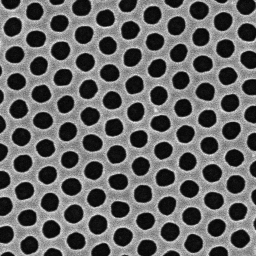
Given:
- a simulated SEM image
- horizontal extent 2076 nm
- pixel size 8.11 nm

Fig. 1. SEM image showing a regular array of holes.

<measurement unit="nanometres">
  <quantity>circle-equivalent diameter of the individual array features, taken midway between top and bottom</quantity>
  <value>151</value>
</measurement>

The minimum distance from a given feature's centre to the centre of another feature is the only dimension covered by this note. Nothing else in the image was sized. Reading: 215 nanometers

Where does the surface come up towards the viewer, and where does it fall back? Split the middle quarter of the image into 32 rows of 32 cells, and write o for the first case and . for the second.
ooo....ooo...ooo..ooo.....oooooo
.ooo..ooo.....ooooooo....ooooooo
..ooooooo.....ooooooo....ooo...o
..ooooooo.....ooo..oooooooo....o
..ooo...oooooooo....ooooooo....o
oooo....ooooooo.....ooooooo....o
oooo....oooooooo....oo....oooooo
oooo....ooo...ooo.ooo.....oooooo
..ooo..ooo....oooooooo....oooooo
...ooooooo....oooooooo...ooo....
...ooooooo....ooo...oooooooo....
..ooo...oooooooo....ooooooo.....
oooo.....ooooooo....oooooooo....
oooo.....ooooooo....oo....oooooo
ooooo...ooo...oooooooo.....ooooo
...ooooooo.....ooooooo.....ooo.o
...ooooooo.....oooooooo...oo....
...ooooooo....ooo....ooooooo....
..ooo....ooooooo.....ooooooo....
ooooo.....ooooooo....ooo..ooo..o
ooooo.....oo..ooo...ooo....ooooo
oooooo...oo....oooooooo....ooooo
...oooooooo.....ooooooo....ooo..
....ooooooo....ooo..ooo...ooo...
....ooo.oooo..ooo....oooooooo...
...ooo....ooooooo.....ooooooo...
ooooo.....ooooooo....ooo..oooo..
ooooo.....ooo..ooo..ooo.....oooo
oooooo...oo.....ooooooo.....oooo
....ooooooo.....ooooooo....ooo..
....oooooooo....ooo..ooo..ooo...
....ooo...ooo.oooo....ooooooo...